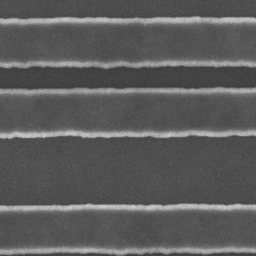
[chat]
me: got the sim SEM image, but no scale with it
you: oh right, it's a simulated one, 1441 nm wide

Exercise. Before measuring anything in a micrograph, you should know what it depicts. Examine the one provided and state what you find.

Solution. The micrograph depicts lines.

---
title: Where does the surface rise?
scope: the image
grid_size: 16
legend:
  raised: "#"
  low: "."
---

................
################
################
################
................
................
################
################
###..##...#.....
................
................
................
................
################
################
################